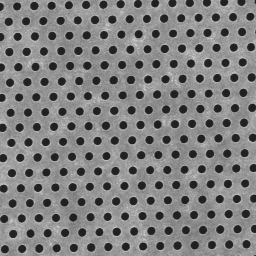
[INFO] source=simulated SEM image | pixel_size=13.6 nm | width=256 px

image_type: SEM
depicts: a regular array of holes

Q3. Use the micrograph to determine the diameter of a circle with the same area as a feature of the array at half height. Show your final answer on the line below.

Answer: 109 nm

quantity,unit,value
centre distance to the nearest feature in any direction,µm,0.232